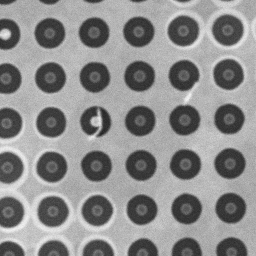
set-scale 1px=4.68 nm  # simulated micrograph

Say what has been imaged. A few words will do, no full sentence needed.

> an array of small figures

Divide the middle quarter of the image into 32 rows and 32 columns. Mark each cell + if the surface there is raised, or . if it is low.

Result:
+++++......+++++......+++++.....
++++.......++++........+++......
++++...++..++++...++...+++...++.
.+++...++...+++...++...+++...++.
++++........+++........+++......
+++++......+++++......+++++.....
++++++....+++++++....+++++++...+
++++++++++++++++++++++++++++++++
++++++++++++++++++++++++++++++++
++++++++++++++++++++++++++++++++
+++++++.++++++++++..++++++++....
+++++.....++++++......+++++.....
++++.......+++++.......+++......
.+++....+...+++...++...+++...++.
.+++...++...+++...++...+++...++.
.+++........+++........++++.....
++++.......+++++......+++++.....
+++++......++++++....+++++++....
++++++++++++++++++++++++++++++++
++++++++++++++++++++++++++++++++
++++++++++++++++++++++++++++++++
++++++++++++++++++..+++++++++...
++++++.....+++++......+++++.....
+++++.......++++.......++++.....
.+++....+...+++....+...++++..+++
.+++...++...+++...++...+++...+++
.+++...++...+++....+...++++.....
.++++......+++++.......++++.....
++++++.....++++++.....++++++....
+++++++..+++++++++++++++++++++++
++++++++++++++++++++++++++++++++
++++++++++++++++++++++++++++++++